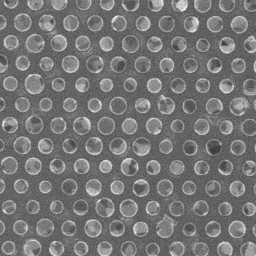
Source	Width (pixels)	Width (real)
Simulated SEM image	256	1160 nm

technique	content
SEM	a regular array of raised bodies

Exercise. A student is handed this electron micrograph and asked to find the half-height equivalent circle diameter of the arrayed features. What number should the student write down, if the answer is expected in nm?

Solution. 66.8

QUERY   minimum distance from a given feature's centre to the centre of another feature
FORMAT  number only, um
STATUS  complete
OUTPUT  0.106